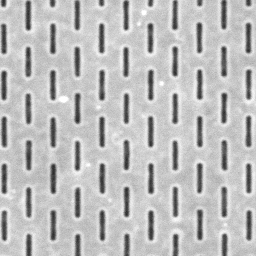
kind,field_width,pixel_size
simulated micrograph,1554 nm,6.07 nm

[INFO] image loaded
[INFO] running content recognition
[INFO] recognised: a regular array of holes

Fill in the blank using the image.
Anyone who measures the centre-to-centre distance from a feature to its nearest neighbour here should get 203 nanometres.